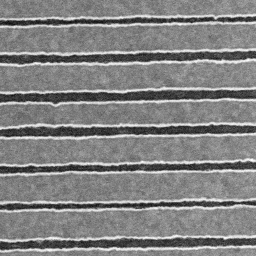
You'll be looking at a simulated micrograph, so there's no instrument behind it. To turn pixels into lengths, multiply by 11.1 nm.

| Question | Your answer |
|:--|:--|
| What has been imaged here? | parallel lines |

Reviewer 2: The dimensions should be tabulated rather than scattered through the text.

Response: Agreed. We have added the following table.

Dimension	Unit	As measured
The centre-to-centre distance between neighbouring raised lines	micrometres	0.409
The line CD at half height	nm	307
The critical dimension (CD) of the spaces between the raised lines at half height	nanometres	102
